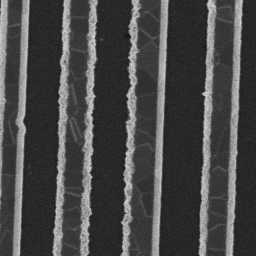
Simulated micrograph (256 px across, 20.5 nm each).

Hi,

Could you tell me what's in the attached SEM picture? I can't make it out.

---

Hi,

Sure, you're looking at one or a few lines or trenches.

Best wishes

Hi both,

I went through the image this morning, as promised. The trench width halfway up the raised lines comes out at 831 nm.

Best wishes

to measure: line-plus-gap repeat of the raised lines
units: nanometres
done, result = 1470